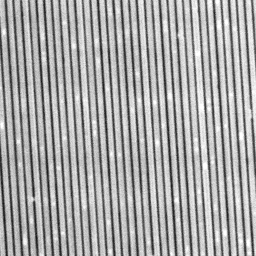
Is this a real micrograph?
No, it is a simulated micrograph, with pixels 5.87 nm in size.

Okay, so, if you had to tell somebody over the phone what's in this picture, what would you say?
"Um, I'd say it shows parallel lines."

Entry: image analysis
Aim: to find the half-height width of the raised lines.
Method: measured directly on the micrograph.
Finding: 31.5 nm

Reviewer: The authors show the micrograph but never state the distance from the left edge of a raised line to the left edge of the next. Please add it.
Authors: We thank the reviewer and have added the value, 0.0451 microns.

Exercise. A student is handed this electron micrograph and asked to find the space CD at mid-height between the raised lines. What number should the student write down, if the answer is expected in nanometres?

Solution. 16.1